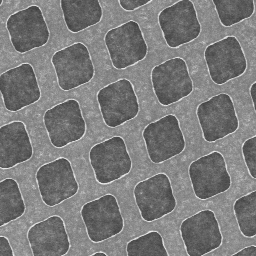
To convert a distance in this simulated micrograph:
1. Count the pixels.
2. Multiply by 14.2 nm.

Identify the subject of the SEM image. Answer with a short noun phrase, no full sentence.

a regular array of holes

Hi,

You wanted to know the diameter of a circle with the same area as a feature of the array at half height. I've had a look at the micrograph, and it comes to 604 nm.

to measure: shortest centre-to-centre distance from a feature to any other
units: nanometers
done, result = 821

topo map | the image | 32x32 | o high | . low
oooooooo....ooo...oooo..ooo.....
oo...ooo.....ooooooo....ooo.....
o.....oo....oooooooo.....ooo..oo
o.....ooo..ooo...ooo.....ooooooo
o.....ooooooo.....ooo....ooooooo
oo....ooo.ooo.....ooo..oooo...oo
oo.oooo....ooo....oooooooo....oo
ooooooo....ooo....ooo..ooo.....o
oo..ooo.....ooooooo....ooo.....o
....ooo.....ooooooo.....oo....oo
.....oo...oooo..ooo.....oooooooo
.....ooooooo.....oo.....ooooooo.
.....ooooooo.....ooo..oooo...ooo
o..oooo...oo.....oooooooo....ooo
oooooo....ooo....oooo.ooo.....oo
o..ooo.....oo..oooo...ooo.....oo
...ooo.....ooooooo.....oo....ooo
....oo....ooo..ooo.....ooo.oooo.
....oooooooo....oo.....ooooooo..
....ooooooo.....ooo...oooo..oo..
..oooo...oo.....oooooooo....ooo.
ooooo....ooo....oooooooo....ooo.
o.ooo....ooo..oooo...ooo.....ooo
..ooo.....ooooooo....ooo.....ooo
...oo....oooo.ooo.....ooo..oooo.
...ooo.oooo....oo.....ooooooo...
...ooooooo.....ooo...oooo.ooo...
..oooo..oo.....ooo.oooo....ooo..
oooo....ooo....oooooooo....ooo..
ooo.....ooo...oooo..ooo.....ooo.
.ooo.....ooooooo....ooo.....oooo
..oo....oooooooo.....oo...oooo..